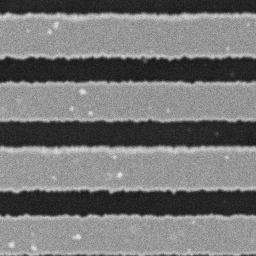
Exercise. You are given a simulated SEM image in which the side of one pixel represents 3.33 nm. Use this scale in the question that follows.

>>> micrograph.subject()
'lines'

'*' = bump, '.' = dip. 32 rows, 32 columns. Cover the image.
................................
................................
********************************
********************************
********************************
********************************
********************************
................................
................................
................................
********************************
********************************
********************************
********************************
********************************
................................
................................
................................
********************************
********************************
********************************
********************************
********************************
********************************
................................
................................
................................
********************************
********************************
********************************
********************************
********************************